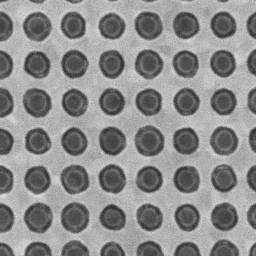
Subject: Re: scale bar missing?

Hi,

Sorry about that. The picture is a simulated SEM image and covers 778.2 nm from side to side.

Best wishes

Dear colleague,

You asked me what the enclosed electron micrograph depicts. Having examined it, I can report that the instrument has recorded a regular array of ring-shaped grooves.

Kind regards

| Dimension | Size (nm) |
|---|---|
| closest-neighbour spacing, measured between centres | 112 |